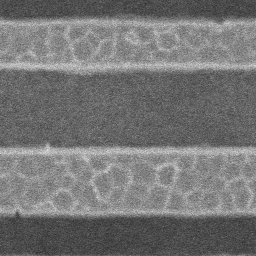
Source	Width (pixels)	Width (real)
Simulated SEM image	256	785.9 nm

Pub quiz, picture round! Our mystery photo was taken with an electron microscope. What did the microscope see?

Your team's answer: one or a few lines or trenches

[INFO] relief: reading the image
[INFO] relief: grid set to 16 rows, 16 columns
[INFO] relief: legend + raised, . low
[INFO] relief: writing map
................
++++++++++++++++
++++++++++++++++
++++++++++++++++
................
................
................
................
................
++++++++++++++++
++++++++++++++++
++++++++++++++++
++++++++++++++++
.....+..........
................
................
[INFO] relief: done